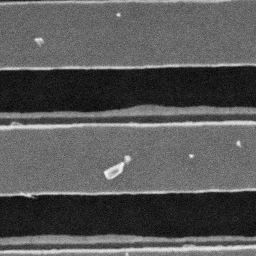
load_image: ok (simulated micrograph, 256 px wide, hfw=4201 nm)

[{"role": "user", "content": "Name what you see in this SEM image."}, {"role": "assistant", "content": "lines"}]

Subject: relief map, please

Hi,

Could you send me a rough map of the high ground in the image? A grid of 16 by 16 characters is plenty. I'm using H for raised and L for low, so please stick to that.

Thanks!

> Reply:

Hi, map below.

HHHHHHHHHHHHHHHH
HHHHHHHHHHHHHHHH
HHHHHHHHHHHHHHHH
HHHHHHHHHHHHHHHH
LLLLLLLLLLLLLLLL
LLLLLLLLLLLLLLLL
LLLLLLLLLLLLLLLL
HHHHHHHHHHHHHHHH
HHHHHHHHHHHHHHHH
HHHHHHHHHHHHHHHH
HHHHHHHHHHHHHHHH
HHHHHHHHHHHHHHHH
LLLLLLLLLLLLLLLL
LLLLLLLLLLLLLLLL
LLLLLLLLLLLLLLLL
HHHHHHHHHHHHHHHH